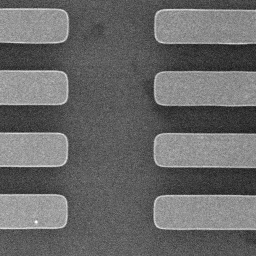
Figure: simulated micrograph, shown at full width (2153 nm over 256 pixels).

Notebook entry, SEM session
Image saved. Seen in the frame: groups of lines, slits or small figures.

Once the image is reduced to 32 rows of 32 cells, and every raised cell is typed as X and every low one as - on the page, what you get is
--------------------------------
XXXXXXXX------------XXXXXXXXXXXX
XXXXXXXX-----------XXXXXXXXXXXXX
XXXXXXXX-----------XXXXXXXXXXXXX
XXXXXXXX-----------XXXXXXXXXXXXX
--------------------------------
--------------------------------
--------------------------------
--------------------------------
XXXXXXXX------------XXXXXXXXXXXX
XXXXXXXX-----------XXXXXXXXXXXXX
XXXXXXXX-----------XXXXXXXXXXXXX
XXXXXXXX-----------XXXXXXXXXXXXX
--------------------------------
--------------------------------
--------------------------------
--------------------------------
XXXXXXXX-----------XXXXXXXXXXXXX
XXXXXXXX-----------XXXXXXXXXXXXX
XXXXXXXX-----------XXXXXXXXXXXXX
XXXXXXXX------------XXXXXXXXXXXX
--------------------------------
--------------------------------
--------------------------------
XXXXXXXX------------XXXXXXXXXXXX
XXXXXXXX-----------XXXXXXXXXXXXX
XXXXXXXX-----------XXXXXXXXXXXXX
XXXXXXXX-----------XXXXXXXXXXXXX
XXXX----------------XXXXXXXXXXXX
--------------------------------
--------------------------------
--------------------------------